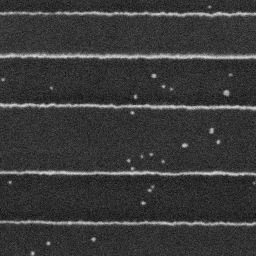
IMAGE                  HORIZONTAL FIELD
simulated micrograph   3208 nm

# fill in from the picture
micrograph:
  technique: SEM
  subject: lines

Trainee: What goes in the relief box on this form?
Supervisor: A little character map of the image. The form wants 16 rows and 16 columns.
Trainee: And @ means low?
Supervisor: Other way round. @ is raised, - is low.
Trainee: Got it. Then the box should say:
----------------
@@@@@@@@@@@@@@@@
@@@@@@@@@@@@@@@@
@@@@@@@@@@@@@@@@
----------------
----------------
----------------
@@@@@@@@@@@@@@@@
@@@@@@@@@@@@@@@@
@@@@@@@@@@@@@@@@
@@@@@@@@@@@@@@@@
----------------
----------------
----------------
@@@@@@@@@@@@@@@@
@@@@@@@@@@@@@@@@